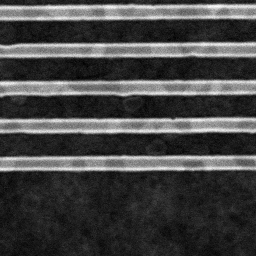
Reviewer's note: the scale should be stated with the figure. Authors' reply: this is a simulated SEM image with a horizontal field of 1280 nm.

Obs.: parallel lines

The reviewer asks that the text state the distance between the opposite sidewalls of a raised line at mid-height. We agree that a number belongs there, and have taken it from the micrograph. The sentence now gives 58.1 nanometres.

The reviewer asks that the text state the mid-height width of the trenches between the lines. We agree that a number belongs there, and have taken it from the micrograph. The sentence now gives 129 nm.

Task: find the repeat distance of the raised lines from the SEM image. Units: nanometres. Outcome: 188